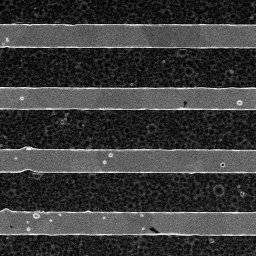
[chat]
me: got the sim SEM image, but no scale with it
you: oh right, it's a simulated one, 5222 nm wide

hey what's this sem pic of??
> one or a few lines or trenches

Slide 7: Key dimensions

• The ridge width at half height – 464 nm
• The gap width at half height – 808 nm